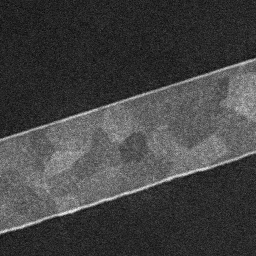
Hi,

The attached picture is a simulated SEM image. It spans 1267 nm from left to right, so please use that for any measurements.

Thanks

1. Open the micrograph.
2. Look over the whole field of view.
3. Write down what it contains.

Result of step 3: one or a few lines or trenches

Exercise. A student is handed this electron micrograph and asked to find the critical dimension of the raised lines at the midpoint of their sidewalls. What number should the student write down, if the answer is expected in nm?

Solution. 438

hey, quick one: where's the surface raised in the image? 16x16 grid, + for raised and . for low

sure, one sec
................
................
................
................
.............+++
..........++++++
.......+++++++++
....++++++++++++
.+++++++++++++++
++++++++++++++++
+++++++++++++...
++++++++++......
+++++++.........
+++.............
................
................